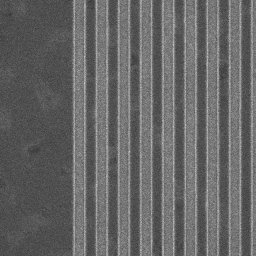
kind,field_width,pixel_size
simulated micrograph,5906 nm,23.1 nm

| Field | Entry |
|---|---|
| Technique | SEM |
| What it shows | parallel lines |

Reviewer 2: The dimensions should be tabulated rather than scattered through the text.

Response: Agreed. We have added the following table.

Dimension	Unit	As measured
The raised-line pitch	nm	512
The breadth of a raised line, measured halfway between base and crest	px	12.6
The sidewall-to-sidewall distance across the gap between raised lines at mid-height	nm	225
